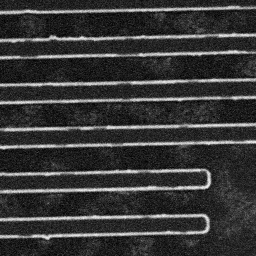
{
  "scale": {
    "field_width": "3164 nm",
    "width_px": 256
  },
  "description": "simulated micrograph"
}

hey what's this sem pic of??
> parallel lines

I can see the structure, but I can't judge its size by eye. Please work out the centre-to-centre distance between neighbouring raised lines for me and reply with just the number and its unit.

553 nanometers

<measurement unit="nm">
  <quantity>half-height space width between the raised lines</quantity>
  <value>316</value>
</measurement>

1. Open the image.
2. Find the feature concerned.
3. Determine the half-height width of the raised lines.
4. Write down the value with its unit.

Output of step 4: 233 nanometers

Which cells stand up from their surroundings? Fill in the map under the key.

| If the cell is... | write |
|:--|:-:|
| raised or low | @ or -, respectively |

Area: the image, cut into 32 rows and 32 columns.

@@@@@@@@@@@@@@@@@@@@@@@@@@@@@@@@
@@@@@@@@------------------------
--------------------------------
--------------------------------
-----------------@-----@@@@@@@@@
@@@@@@@@@@@@@@@@@@@@@@@@@@@@@@@@
@@@@@@@@@@@@@@@@@@@@@@@@@@@@@@@@
--------------------------------
--------------------------------
--------------------------------
-----@@@@@@@@@@@@@@@@@@@@@@@@@@@
@@@@@@@@@@@@@@@@@@@@@@@@@@@@@@@@
@@@@@@@@@@@@@@@@@@-@@@@---------
--------------------------------
--------------------------------
-------------------------------@
@@@@@@@@@@@@@@@@@@@@@@@@@@@@@@@@
@@@@@@@@@@@@@@@@@@@@@@@@@@@@@@@@
@-------------------------------
--------------------------------
--------------------------------
-----------@@@@@@@@@@@@@@@------
@@@@@@@@@@@@@@@@@@@@@@@@@@------
@@@@@@@@@@@@@@@@@@@@@@@@@@------
--------------------------------
--------------------------------
--------------------------------
@@@@@@@@@@@@@@@@@@@@@@@@@@------
@@@@@@@@@@@@@@@@@@@@@@@@@@------
@@@@@@@@@@----------------------
--------------------------------
--------------------------------